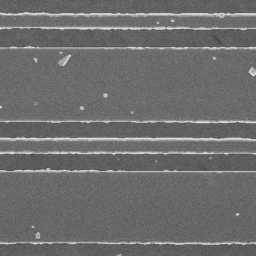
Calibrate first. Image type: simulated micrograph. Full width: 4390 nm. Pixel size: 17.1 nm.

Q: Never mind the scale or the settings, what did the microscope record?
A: lines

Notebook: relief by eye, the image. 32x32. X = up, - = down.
--------------------------------
--------------------------------
XXXXXXXXXXXXXXXXXXXXXXXXXXXXXXXX
X----XXXX-XXXXXXXXXXXXXXXXXXXXXX
--------------------------------
--------------------------------
XXXXXXXXXXXXXXXXXXXXXXXXXXXXXXXX
XXXXXXXXXXXXXXXXXXXXXXXXXXXXXXXX
XXXXXXXXXXXXXXXXXXXXXXXXXXXXXXXX
XXXXXXXXXXXXXXXXXXXXXXXXXXXXXXXX
XXXXXXXXXXXXXXXXXXXXXXXXXXXXXXXX
XXXXXXXXXXXXXXXXXXXXXXXXXXXXXXXX
XXXXXXXXXXXXXXXXXXXXXXXXXXXXXXXX
XXXXXXXXXXXXXXXXXXXXXXXXXXXXXXXX
XXXXXXXXXXXXXXXXXXXXXXXXXXXXXXXX
--------------------------------
--------------------------------
XXXXXXXXXXXXXXXXXXXXXXXXXXXXXXXX
XXXXXXXXXXXXXXXXXXXXXXXXXXXXXXXX
--------------------------------
--------------------------------
XXXXXXXXXXXXXXXXXXXXXXXXXXXXXXXX
XXXXXXXXXXXXXXXXXXXXXXXXXXXXXXXX
XXXXXXXXXXXXXXXXXXXXXXXXXXXXXXXX
XXXXXXXXXXXXXXXXXXXXXXXXXXXXXXXX
XXXXXXXXXXXXXXXXXXXXXXXXXXXXXXXX
XXXXXXXXXXXXXXXXXXXXXXXXXXXXXXXX
XXXXXXXXXXXXXXXXXXXXXXXXXXXXXXXX
XXXXXXXXXXXXXXXXXXXXXXXXXXXXXXXX
XXXXXXXXXXXXXXXXXXXXXXXXXXXXXXXX
--------------------------------
--------------------------------